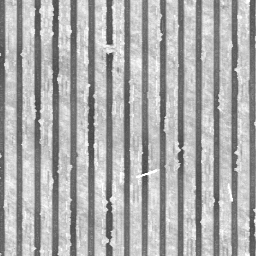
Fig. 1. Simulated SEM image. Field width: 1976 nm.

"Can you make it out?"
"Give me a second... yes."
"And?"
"parallel lines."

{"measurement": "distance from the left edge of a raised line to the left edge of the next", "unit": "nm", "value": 138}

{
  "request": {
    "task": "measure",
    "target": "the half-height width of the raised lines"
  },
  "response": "0.0792 µm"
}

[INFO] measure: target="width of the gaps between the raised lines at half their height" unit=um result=0.0589